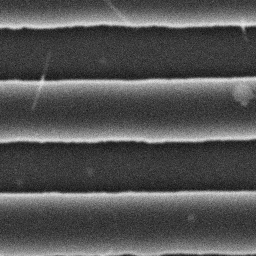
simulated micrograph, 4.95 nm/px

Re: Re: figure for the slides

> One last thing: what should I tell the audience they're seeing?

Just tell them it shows lines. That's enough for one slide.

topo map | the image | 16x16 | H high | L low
HHHHHHHHHHHHHHHH
HHHHHHHHHHHHHHHH
LLLLLLLLLLLLLLLL
LLLLLLLLLLLLLLLL
LLLLLLLLLLLLLLLL
HHHHHHHHHHHHHHHH
HHHHHHHHHHHHHHHH
HHHHHHHHHHHHHHHH
HHHHHHHHHHHHHHHH
LLLLLLLLLLLLLLLL
LLLLLLLLLLLLLLLL
LLLLLLLLLLLLLLLL
HHHHHHHHHHHHHHHH
HHHHHHHHHHHHHHHH
HHHHHHHHHHHHHHHH
HHHHHHHHHHHHHHHH